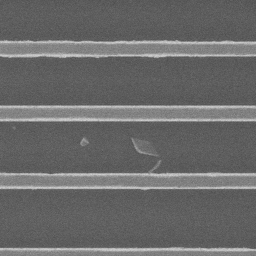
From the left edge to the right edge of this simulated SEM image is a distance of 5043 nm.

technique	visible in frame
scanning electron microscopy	lines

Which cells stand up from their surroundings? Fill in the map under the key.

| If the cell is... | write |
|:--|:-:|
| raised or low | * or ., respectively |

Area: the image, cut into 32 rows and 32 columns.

................................
................................
................................
................................
................................
********************************
********************************
................................
................................
................................
................................
................................
................................
********************************
********************************
................................
................................
................................
................................
................................
................................
................................
********************************
********************************
................................
................................
................................
................................
................................
................................
................................
********************************